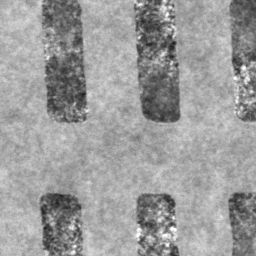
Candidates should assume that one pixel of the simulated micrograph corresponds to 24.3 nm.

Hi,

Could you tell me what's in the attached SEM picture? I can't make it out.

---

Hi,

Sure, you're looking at holes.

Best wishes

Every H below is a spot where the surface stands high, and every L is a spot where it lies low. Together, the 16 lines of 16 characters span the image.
HHHLLHHHLLLHHHLL
HHHLLHHHLLLHHHLL
HHHLLHHHLLLHHHLL
HHHLLHHHHLLHHHLL
HHHLLHHHHLLHHHHL
HHHLLHHHHLLHHHHL
HHHLLHHHHLLHHHHL
HHHLLHHHHLLHHHHL
HHHHHHHHHHHHHHHH
HHHHHHHHHHHHHHHH
HHHHHHHHHHHHHHHH
HHHHHHHHHHHHHHHH
HHHLLHHHHLLHHHLL
HHHLLHHHLLLHHHLL
HHHLLHHHLLLHHHLL
HHHLLHHHHLLHHHHL